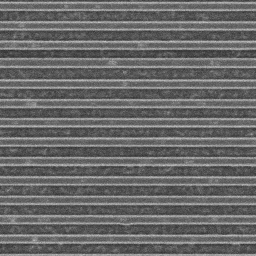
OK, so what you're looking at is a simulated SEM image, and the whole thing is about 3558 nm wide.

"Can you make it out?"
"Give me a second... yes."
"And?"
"parallel lines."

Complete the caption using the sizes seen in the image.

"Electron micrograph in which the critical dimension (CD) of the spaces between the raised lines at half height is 153 nanometres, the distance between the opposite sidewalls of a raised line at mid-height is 115 nm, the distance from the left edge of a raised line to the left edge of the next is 0.27 micrometres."